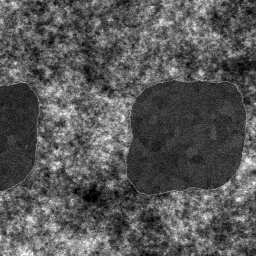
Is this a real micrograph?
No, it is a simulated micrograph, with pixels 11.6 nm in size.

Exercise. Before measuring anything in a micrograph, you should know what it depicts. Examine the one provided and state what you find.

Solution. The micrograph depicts raised bodies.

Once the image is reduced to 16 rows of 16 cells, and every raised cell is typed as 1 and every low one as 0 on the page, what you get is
0000000000000000
0000000000000000
0000000000000000
0000000000000000
0000000000000000
1100000001111110
1100000011111110
1100000011111110
1100000011111110
1100000011111110
1100000011111110
1000000011111100
0000000000000000
0000000000000000
0000000000000000
0000000000000000